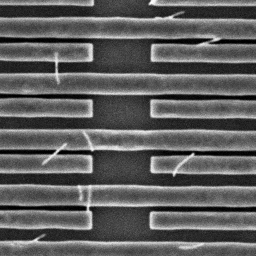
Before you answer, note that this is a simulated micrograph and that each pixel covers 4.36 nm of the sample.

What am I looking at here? wiring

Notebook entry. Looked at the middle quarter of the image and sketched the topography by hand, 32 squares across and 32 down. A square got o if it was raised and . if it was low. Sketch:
................................
................................
oooooooo........................
oooooooooooooooooooooooooooooooo
oooooooooooooooooooooooooooooooo
oooooooooooooooooooooooooooooooo
oooooooooooooooooooooooooooooooo
.........oooooooooooooooo.......
................................
ooooooo...............oooooooooo
ooooooo...............oooooooooo
ooooooo...............oooooooooo
ooooooo...............oooooooooo
................................
................................
................................
ooooooooooo...................oo
oooooooooooooooooooooooooooooooo
oooooooooooooooooooooooooooooooo
oooooooooooooooooooooooooooooooo
oooooooooooooooooooooooooooooooo
......oo........................
................................
ooooooo...............oooooooooo
ooooooo...............oooooooooo
ooooooo...............oooooooooo
ooooooo...............oooooooooo
...........................o....
................................
................................
...o..ooooooooooooo.............
oooooooooooooooooooooooooooooooo